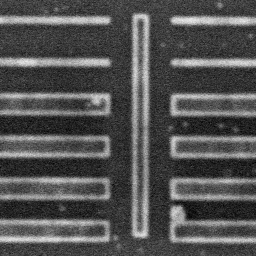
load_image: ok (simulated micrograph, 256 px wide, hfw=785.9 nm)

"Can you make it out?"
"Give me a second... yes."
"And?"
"groups of lines, slits or small figures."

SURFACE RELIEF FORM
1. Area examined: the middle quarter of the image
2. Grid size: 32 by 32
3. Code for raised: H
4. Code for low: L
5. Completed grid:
LLLLLLLLLLLLLLLLLLHHLLLLLLLLLLLL
LLLLLLLLLLLLLLLLLLHHLLLLLLLLLLLL
LLLLLLLLLLLLLLLLLLHHLLLLLLLLLLLL
LLLLLLLLLLLLLLLLLLHHLLLLLLLLLLLL
LLLLLLLLLLLLLLLLLLHHLLLLLLLLLLLL
LLLLLLLLLLLLLLLLLLHHLLLLLLLLLLLL
LLLLLLLLLLLLLLLLLLHHLLLLLLLLLLLL
LLLLLLLLLLLLLLLLLLHHLLLLLLLLLLLL
HHHHHHHHHHHLLLLLLLHHLLLLLLLHHHHH
HHHHHHHHHHHLLLLLLLHHLLLLLLLHHHHH
HHHHHHHHHHHLLLLLLLHHLLLLLLLHHHHH
HHHHHHHHHHHLLLLLLLHHLLLLLLLHHHHH
LLLLLLLLLLLLLLLLLLHHLLLLLLLLHHHH
LLLLLLLLLLLLLLLLLLHHLLLLLLLLLLLL
LLLLLLLLLLLLLLLLLLHHLLLLLLLLLLLL
LLLLLLLLLLLLLLLLLLHHLLLLLLLLLLLL
LLLLLLLLLLLLLLLLLLHHLLLLLLLLLLLL
LLLLLLLLLLLLLLLLLLHHLLLLLLLLLLLL
HHHHHHHHHHHLLLLLLLHHLLLLLLLLHHHH
HHHHHHHHHHHLLLLLLLHHLLLLLLLHHHHH
HHHHHHHHHHHLLLLLLLHHLLLLLLLHHHHH
HHHHHHHHHHHLLLLLLLHHLLLLLLLHHHHH
HHHHHHHHHHHLLLLLLLHHLLLLLLLHHHHH
LLLLLLLLLLLLLLLLLLHHLLLLLLLLLLLL
LLLLLLLLLLLLLLLLLLHHLLLLLLLLLLLL
LLLLLLLLLLLLLLLLLLHHLLLLLLLLLLLL
LLLLLLLLLLLLLLLLLLHHLLLLLLLLLLLL
LLLLLLLLLLLLLLLLLLHHLLLLLLLLLLLL
LLLLLLLLLLLLLLLLLLHHLLLLLLLLLLLL
HHHHHHHHHHHLLLLLLLHHLLLLLLLHHHHH
HHHHHHHHHHHLLLLLLLHHLLLLLLLHHHHH
HHHHHHHHHHHLLLLLLLHHLLLLLLLHHHHH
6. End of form